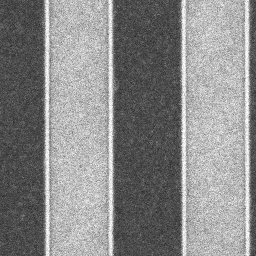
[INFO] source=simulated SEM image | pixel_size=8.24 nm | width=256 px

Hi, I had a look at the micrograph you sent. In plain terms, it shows one or a few lines or trenches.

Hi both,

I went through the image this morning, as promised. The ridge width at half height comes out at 0.607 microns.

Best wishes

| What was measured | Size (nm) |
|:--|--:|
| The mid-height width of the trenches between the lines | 520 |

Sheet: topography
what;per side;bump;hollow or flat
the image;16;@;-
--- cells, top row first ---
@@@----@@@@----@
@@@----@@@@----@
@@@----@@@@----@
@@@----@@@@----@
@@@----@@@@----@
@@@----@@@@@---@
@@@----@@@@----@
@@@----@@@@----@
@@@----@@@@----@
@@@----@@@@----@
@@@----@@@@----@
@@@----@@@@----@
@@@----@@@@----@
@@@----@@@@----@
@@@----@@@@----@
@@@----@@@@----@